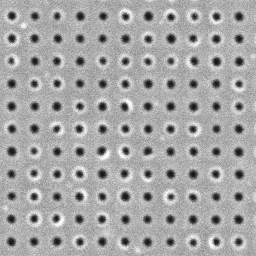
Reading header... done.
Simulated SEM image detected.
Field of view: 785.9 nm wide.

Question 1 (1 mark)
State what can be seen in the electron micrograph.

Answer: a regular array of holes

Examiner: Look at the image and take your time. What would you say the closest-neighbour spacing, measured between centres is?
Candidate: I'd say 68.1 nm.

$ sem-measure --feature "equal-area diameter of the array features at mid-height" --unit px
8.66